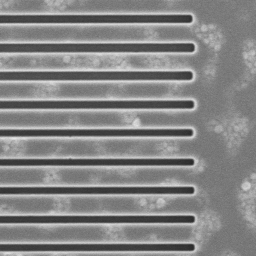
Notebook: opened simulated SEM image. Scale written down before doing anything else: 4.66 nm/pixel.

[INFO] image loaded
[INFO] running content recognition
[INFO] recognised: parallel lines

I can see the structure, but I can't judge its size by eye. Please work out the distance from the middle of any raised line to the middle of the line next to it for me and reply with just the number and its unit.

133 nm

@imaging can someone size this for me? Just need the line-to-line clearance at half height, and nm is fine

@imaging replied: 37.3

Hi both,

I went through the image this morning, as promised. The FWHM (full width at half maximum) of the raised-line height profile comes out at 95.5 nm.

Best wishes